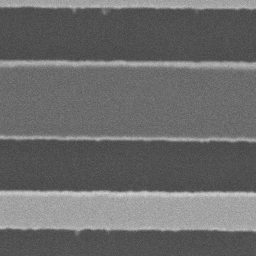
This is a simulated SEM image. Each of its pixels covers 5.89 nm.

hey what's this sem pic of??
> lines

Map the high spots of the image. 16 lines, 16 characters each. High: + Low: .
....++.+.+++++++
................
................
................
++++++++++++++++
++++++++++++++++
++++++++++++++++
++++++++++++++++
++++++++++++++++
................
................
................
++++++++++++++++
++++++++++++++++
................
................